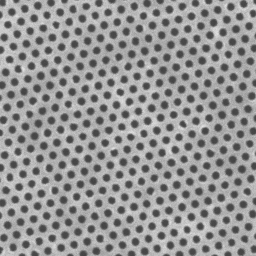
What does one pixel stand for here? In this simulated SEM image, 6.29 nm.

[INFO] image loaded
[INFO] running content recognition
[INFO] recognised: a regular array of holes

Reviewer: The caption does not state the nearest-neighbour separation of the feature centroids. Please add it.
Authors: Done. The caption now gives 82.4 nm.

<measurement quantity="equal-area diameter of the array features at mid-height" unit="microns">0.0507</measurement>